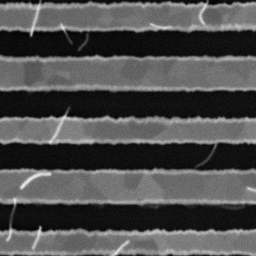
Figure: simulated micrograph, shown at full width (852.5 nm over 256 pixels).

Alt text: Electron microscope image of lines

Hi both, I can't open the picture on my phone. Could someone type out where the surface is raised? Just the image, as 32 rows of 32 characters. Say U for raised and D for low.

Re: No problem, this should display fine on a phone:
DUUUDUUDUUUUUDUUUUUUUUUDDUDDDUUU
UUUUUUUUUUUUUUUUUUUUUUUUUUUUUUUU
UUUUUUUUUUUUUUUUUUUUUUUUUUUUUUUU
UUUUUUUUUUUUUUUUUUUUUUUUUUUUUUUU
DDDDDDDDDDDDDDDDDDDDDDDDDDDDDDDD
DDDDDDDDDDDDDDDDDDDDDDDDDDDDDDDD
DDDDDDDDDDDDDDDDDDDDDDDDDDDDDDDD
UUUUUUUUUUUUUUUUUUUUUUUUUUUUUUUU
UUUUUUUUUUUUUUUUUUUUUUUUUUUUUUUU
UUUUUUUUUUUUUUUUUUUUUUUUUUUUUUUU
UUUUUUUUUUUUUUUUUUUUUUUUUUUUUUUU
DDDDDDDDDDDDDDDDDDDDDDDDDDDDDDDD
DDDDDDDDDDDDDDDDDDDDDDDDDDDDDDDD
DDDDDDDDDDDDDDDDDDDDDDDDDDDDDDDD
DDDDDDDDDDDDDDDDDDDDDDDDDDDDDDDD
UUUUUUUUUUUUUUUUUUUUUUUUUUUUUUUU
UUUUUUUUUUUUUUUUUUUUUUUUUUUUUUUU
UUUUUUUUUUUUUUUUUUUUUUUUUUUUUUUU
DDDDDDDDDDDDDDDDDDDDDDDDDDDDDDDD
DDDDDDDDDDDDDDDDDDDDDDDDDDDDDDDD
DDDDDDDDDDDDDDDDDDDDDDDDDDDDDDDD
UUUUUUUUUUUUUUUUUUUUUUUUUUUUUUUU
UUUUUUUUUUUUUUUUUUUUUUUUUUUUUUUU
UUUUUUUUUUUUUUUUUUUUUUUUUUUUUUUU
UUUUUUUUUUUUUUUUUUUUUUUUUUUUUUUU
DUDDDDDDDDDDDDDDDDDDDDDDDDDDDDDD
DDDDDDDDDDDDDDDDDDDDDDDDDDDDDDDD
DDDDDDDDDDDDDDDDDDDDDDDDDDDDDDDD
DDDDDDDDDDDDDDDDDDDDDDDDDDDDDDDD
UUUUUUUUUUUUUUUUUUUUUUUUUUUUUUUU
UUUUUUUUUUUUUUUUUUUUUUUUUUUUUUUU
UUUUUUUUUUUUUUUUUUUUUUUUUUUUUUUU